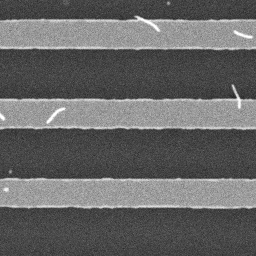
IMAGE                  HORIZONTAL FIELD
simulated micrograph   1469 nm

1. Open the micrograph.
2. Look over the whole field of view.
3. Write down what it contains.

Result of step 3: lines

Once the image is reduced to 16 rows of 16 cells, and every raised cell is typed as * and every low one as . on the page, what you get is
................
****************
****************
................
................
................
****************
****************
................
................
................
****************
****************
................
................
................